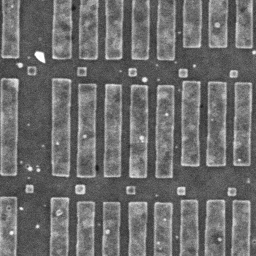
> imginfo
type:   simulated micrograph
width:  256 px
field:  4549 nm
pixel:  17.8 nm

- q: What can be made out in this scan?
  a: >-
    wiring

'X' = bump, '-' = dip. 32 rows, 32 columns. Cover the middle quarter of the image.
--------------------------------
----X------------X--------------
----X-----------XX-----------XX-
--------------------------------
X-------------------------------
X---XXXX---XXX----------------XX
X---XXXX---XXX---XXXX---XXX---XX
X---XXXX---XXX---XXXX---XXX---XX
X---XXXX---XXX---XXXX---XXX---XX
X---XXXX---XXX---XXXX---XXX---XX
X---XXXX---XXX---XXXX--XXXX---XX
X---XXXX---XXX---XXXX--XXXX---XX
X---XXXX---XXX---XXXX--XXXX---XX
X---XXX----XXX---XXXX--XXXX---XX
X---XXX----XXX---XXXX--XXXX---XX
X---XXX----XXX---XXXX--XXXX---XX
X---XXX----XXX---XXXX--XXXX---XX
X---XXX----XXX---XXXX--XXXX---XX
X---XXX----XXX---XXXX--XXXX---XX
X---XXX---XXXX---XXXX--XXXX---XX
X---XXX---XXXX---XXXX--XXXX---XX
X---XXX---XXXX---XXX---XXXX---XX
X---XXX---XXXX---XXX---XXXX---XX
X---XXX---XXXX---XXX---XXXX---XX
X---XXX---XXXX---XXX---XXXX---XX
X---XXX---XXXX---XXX---XXXX-----
X---XXX---XXXX---XXX---XXXX-----
X---XXX---XXXX---XXX---XXXX-----
--------------------------------
--------------------------------
--------------------------------
---XX-----------XX-----------X--